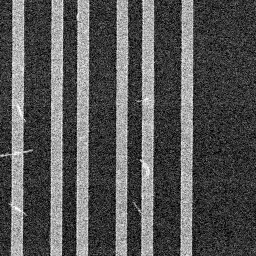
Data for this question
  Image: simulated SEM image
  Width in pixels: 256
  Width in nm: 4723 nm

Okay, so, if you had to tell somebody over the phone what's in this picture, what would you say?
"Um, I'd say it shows parallel lines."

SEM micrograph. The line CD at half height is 198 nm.